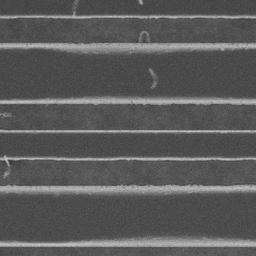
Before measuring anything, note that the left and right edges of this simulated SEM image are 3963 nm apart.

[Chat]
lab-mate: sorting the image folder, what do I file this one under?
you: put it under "lines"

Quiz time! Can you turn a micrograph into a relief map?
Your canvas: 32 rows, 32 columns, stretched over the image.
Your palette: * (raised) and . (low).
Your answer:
********************************
********************************
................................
................................
................................
................................
********************************
********************************
********************************
********************************
********************************
********************************
********************************
................................
................................
................................
********************************
********************************
********************************
********************************
................................
................................
................................
********************************
********************************
********************************
********************************
********************************
********************************
********************************
********************************
................................